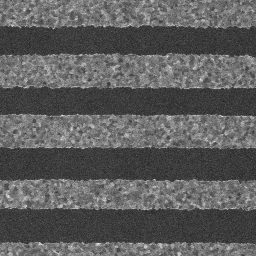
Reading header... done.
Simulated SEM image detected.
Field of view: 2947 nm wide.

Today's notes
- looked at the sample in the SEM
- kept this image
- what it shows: one or a few lines or trenches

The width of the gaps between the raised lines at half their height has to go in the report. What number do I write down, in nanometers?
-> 364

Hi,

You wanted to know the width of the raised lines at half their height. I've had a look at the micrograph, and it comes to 364 nm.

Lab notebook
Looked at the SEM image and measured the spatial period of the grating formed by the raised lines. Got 707 nm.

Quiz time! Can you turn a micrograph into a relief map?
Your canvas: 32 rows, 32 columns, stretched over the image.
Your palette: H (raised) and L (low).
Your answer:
HHHHHHHHHHHHHHHHHHHHHHHHHHHHHHHH
HHHHHHHHHHHHHHHHHHHHHHHHHHHHHHHH
HHHHHHHHHHHHHHHHHHHHHHHHHHHHHHHH
LLLLLLLLLLLLLLLLLLLLLLLLLLLLLLLL
LLLLLLLLLLLLLLLLLLLLLLLLLLLLLLLL
LLLLLLLLLLLLLLLLLLLLLLLLLLLLLLLL
LLLLLLLLLLLLLLLLLLLLLLLLLLLLLLLL
HHHHHHHHHHHHHHHHHHHHHHHHHHHHHHHH
HHHHHHHHHHHHHHHHHHHHHHHHHHHHHHHH
HHHHHHHHHHHHHHHHHHHHHHHHHHHHHHHH
HHHHHHHHHHHHHHHHHHHHHHHHHHHHHHHH
LLLLLLLLLLLLLLLLLLLLLLLLLLLLLLLL
LLLLLLLLLLLLLLLLLLLLLLLLLLLLLLLL
LLLLLLLLLLLLLLLLLLLLLLLLLLLLLLLL
HHHHHHLHHHHHHHHHHLLHHHHHHHHHLLLL
HHHHHHHHHHHHHHHHHHHHHHHHHHHHHHHH
HHHHHHHHHHHHHHHHHHHHHHHHHHHHHHHH
HHHHHHHHHHHHHHHHHHHHHHHHHHHHHHHH
LHLLLLLLLLHLLLLLLLLLLLLLLLLHHHLL
LLLLLLLLLLLLLLLLLLLLLLLLLLLLLLLL
LLLLLLLLLLLLLLLLLLLLLLLLLLLLLLLL
LLLLLLLLLLLLLLLLLLLLLLLLLLLLLLLL
LLLLLHLHHLLLHHHHLHLLLLLLLLLLLLLL
HHHHHHHHHHHHHHHHHHHHHHHHHHHHHHHH
HHHHHHHHHHHHHHHHHHHHHHHHHHHHHHHH
HHHHHHHHHHHHHHHHHHHHHHHHHHHHHHHH
LLLLLLLLLLLLLLLLLLLLLLLLLLLLLLLL
LLLLLLLLLLLLLLLLLLLLLLLLLLLLLLLL
LLLLLLLLLLLLLLLLLLLLLLLLLLLLLLLL
LLLLLLLLLLLLLLLLLLLLLLLLLLLLLLLL
HHHHHHHHHHHHHHHHHHHHHHHHHHHHHHHL
HHHHHHHHHHHHHHHHHHHHHHHHHHHHHHHH